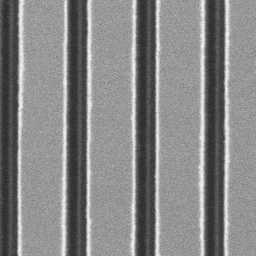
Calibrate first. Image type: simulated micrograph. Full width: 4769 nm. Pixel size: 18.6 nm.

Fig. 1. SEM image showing lines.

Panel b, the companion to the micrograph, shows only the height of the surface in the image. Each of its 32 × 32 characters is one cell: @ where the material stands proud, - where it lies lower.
--@@@@@@---@@@@@@---@@@@@@--@@@@
--@@@@@@---@@@@@@---@@@@@@--@@@@
--@@@@@@---@@@@@@---@@@@@@--@@@@
--@@@@@@---@@@@@@---@@@@@@--@@@@
--@@@@@@---@@@@@@---@@@@@@--@@@@
--@@@@@@---@@@@@@---@@@@@@--@@@@
--@@@@@@---@@@@@@---@@@@@@--@@@@
--@@@@@@---@@@@@@---@@@@@@--@@@@
--@@@@@@---@@@@@@---@@@@@@--@@@@
--@@@@@@---@@@@@@---@@@@@@--@@@@
--@@@@@@---@@@@@@---@@@@@@--@@@@
--@@@@@@---@@@@@@---@@@@@@--@@@@
--@@@@@@---@@@@@@---@@@@@@--@@@@
--@@@@@@---@@@@@@---@@@@@@--@@@@
--@@@@@@---@@@@@@---@@@@@@--@@@@
--@@@@@@---@@@@@@---@@@@@@--@@@@
--@@@@@@---@@@@@@---@@@@@@--@@@@
--@@@@@@---@@@@@@---@@@@@@--@@@@
--@@@@@@---@@@@@@---@@@@@@--@@@@
--@@@@@@---@@@@@@---@@@@@@--@@@@
--@@@@@@---@@@@@@---@@@@@@--@@@@
--@@@@@@---@@@@@@--@@@@@@@--@@@@
--@@@@@@---@@@@@@--@@@@@@@--@@@@
--@@@@@@---@@@@@@---@@@@@@--@@@@
--@@@@@@---@@@@@@--@@@@@@@--@@@@
--@@@@@@---@@@@@@--@@@@@@@--@@@@
--@@@@@@---@@@@@@---@@@@@@--@@@@
--@@@@@@---@@@@@@---@@@@@@--@@@@
--@@@@@@---@@@@@@--@@@@@@@--@@@@
--@@@@@@---@@@@@@--@@@@@@@--@@@@
--@@@@@@---@@@@@@--@@@@@@@--@@@@
--@@@@@@---@@@@@@--@@@@@@@--@@@@